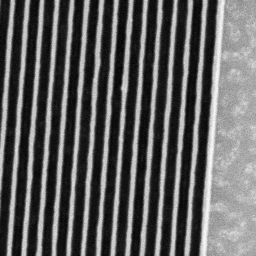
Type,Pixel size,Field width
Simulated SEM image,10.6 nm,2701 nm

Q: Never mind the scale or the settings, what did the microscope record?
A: parallel lines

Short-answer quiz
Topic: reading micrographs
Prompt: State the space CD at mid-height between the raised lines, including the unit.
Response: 101 nanometers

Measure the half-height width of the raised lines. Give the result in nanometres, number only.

60.5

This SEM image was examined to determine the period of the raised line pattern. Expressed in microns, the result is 0.156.